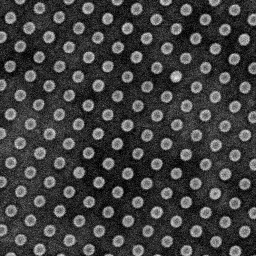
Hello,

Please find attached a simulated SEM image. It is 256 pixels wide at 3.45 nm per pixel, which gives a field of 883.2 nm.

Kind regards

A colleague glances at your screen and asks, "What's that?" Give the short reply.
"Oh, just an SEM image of a regular array of raised bodies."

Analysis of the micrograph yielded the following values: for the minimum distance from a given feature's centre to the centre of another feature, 0.0732 um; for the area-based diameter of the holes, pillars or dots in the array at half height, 37.3 nanometres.